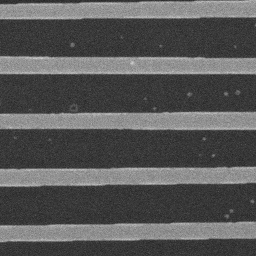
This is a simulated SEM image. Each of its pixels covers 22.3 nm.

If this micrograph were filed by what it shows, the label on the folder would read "lines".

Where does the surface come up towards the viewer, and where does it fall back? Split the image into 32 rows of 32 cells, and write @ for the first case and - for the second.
--@@@@@@@@@@@@@@@@@@@@@@@@@@@@@@
@@@@@@@@@@@@@@@@@@@@@@@@@@@@@@@@
--------------------------------
--------------------------------
--------------------------------
--------------------------------
--------------------------------
@@@@@@@@@@@@@@@@@@@@@@@@@@@@@@@@
@@@@@@@@@@@@@@@@@@@@@@@@@@@@@@@@
--------------------------------
--------------------------------
--------------------------------
--------------------------------
--------------------------------
@@@@@@@@@@@@@@@@@@@@@@@@@@@@@@@@
@@@@@@@@@@@@@@@@@@@@@@@@@@@@@@@@
--------------------------------
--------------------------------
--------------------------------
--------------------------------
--------------------------------
@@@@@@@@@@@@@@@@@@@@@@@@@@@@@@@@
@@@@@@@@@@@@@@@@@@@@@@@@@@@@@@@@
--------------------------------
--------------------------------
--------------------------------
--------------------------------
--------------------------------
@@@@@@@@@@@@@@@@@@@@@@@@@@@@@@@@
@@@@@@@@@@@@@@@@@@@@@@@@@@@@@@@@
--------------------------------
--------------------------------